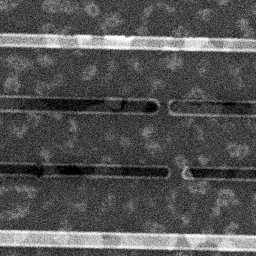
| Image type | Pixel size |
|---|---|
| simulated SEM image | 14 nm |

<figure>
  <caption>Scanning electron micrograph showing one or a few lines or trenches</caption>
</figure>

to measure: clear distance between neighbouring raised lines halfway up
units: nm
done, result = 740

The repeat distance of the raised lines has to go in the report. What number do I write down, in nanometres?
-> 921